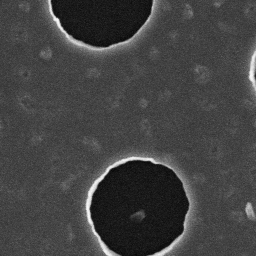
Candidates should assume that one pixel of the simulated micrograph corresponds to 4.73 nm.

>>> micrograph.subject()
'holes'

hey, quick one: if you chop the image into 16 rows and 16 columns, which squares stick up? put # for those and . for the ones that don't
###......#######
####.....#######
#####...########
################
################
################
################
################
################
################
#######....#####
######.....#####
######......####
######......####
######.....#####
#######...######